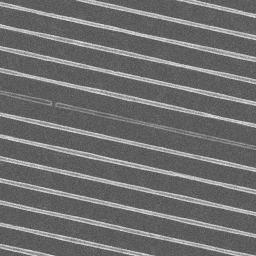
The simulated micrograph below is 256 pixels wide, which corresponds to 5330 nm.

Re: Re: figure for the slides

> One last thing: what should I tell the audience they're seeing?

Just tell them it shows parallel lines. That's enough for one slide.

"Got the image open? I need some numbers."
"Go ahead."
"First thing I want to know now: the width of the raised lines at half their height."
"55.9 nanometers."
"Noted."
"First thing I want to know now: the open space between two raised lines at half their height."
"399 nm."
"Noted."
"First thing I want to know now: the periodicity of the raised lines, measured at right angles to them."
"448 nanometers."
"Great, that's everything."